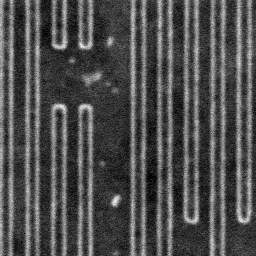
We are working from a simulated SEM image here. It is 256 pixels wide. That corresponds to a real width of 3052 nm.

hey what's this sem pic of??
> wiring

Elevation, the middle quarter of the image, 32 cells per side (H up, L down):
LLLLLLLLLLLLLLLLLHHHLLLLHHHLLLHH
LLLLLLLLLLLLLLLLLHHHLLLLHHHLLLHH
LLLLLLLLLLLLLLLLLHHHLLLLHHHLLLHH
LLLLLLLLLLLLLLLLLHHHLLLLHHHLLLHH
LLLLLLLLLLLLLLLLLHHHLLLLHHHLLLHH
LLLLLLLLLLLLLLLLLHHHLLLLHHHLLLHH
LLLLLLLLLLLLLLLLLHHHLLLLHHHLLLHH
LLLLLLLLLLLLLLLLLHHHLLLLHHHLLLHH
LLLLLLLLLLLLLLLLLHHHLLLLHHHLLLHH
LLLLLLLLLLLLLLLLLHHHLLLLHHHLLLHH
LLLLLHLLLLLLLLLLLHHHLLLLHHHLLLHH
LLLLHHHLLLLLLLLLLHHHLLLLHHHLLLHH
LLLLHHHLLLLLLLLLLHHHLLLLHHHLLLHH
LLLLHHHLLLLLLLLLLHHHLLLLHHHLLLHH
LLLLHHHLLLLLLLLLLHHHLLLLHHHLLLHH
LLLLHHHLLLLLLLLLLHHHLLLLHHHLLLHH
LLLLHHHLLLLLLLLLLHHHLLLLHHHLLLHH
LLLLHHHLLLLLLLLLLHHHLLLLHHHLLLHH
LLLLHHHLLLLLLLLLLHHHLLLLHHHLLLHH
LLLLHHHLLLLLLLLLLHHHLLLLHHHLLLHH
LLLLHHHLLLLLLLLLLHHHLLLLHHHLLLHH
LLLLHHHLLLLLLLLLLHHHLLLLHHHLLLHH
LLLLHHHLLLLLLLLLLHHHLLLLHHHLLLHH
LLLLHHHLLLLLLLLLLHHHLLLLHHHLLLHH
LLLLHHHLLLLLLLLLLHHHLLLLHHHLLLHH
LLLLHHHLLLLLLLLLLHHHLLLLHHHLLLHH
LLLLHHHLLLLLLLLLLHHHLLLLHHHLLLHH
LLLLHHHLLLLLLLLLLHHHLLLLHHHLLLHH
LLLLHHHLLLLLLLLLLHHHLLLLHHHLLLHH
LLLLHHHLLLLLLLLLLHHHLLLLHHHLLLHH
LLLLHHHLLLLLLLLLLHHHLLLLHHHLLLHH
LLLLHHHLLLLLLLLLLHHHLLLLHHHLLLHH